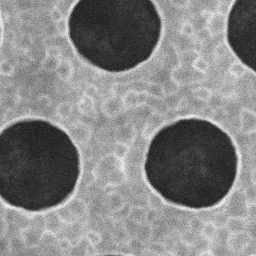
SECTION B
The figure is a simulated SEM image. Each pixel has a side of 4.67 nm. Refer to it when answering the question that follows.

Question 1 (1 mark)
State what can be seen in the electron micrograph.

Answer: holes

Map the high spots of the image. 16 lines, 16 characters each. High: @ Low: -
@@@@@-----@@@@--
@@@@------@@@@--
@@@@------@@@@--
@@@@@----@@@@@@-
@@@@@@@@@@@@@@@@
@@@@@@@@@@@@@@@@
@@@@@@@@@@@@@@@@
@@@@@@@@@@@--@@@
----@@@@@@----@@
-----@@@@------@
-----@@@@------@
-----@@@@------@
----@@@@@@----@@
@@@@@@@@@@@@@@@@
@@@@@@@@@@@@@@@@
@@@@@@@@@@@@@@@@